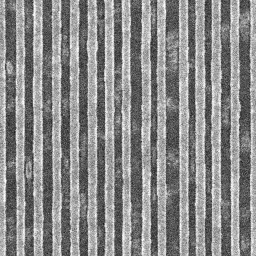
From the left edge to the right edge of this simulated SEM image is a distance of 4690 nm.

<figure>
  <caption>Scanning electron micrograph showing parallel lines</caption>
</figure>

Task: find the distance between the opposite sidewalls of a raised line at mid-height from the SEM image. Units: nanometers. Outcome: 133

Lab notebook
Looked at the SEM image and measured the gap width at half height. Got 0.183 um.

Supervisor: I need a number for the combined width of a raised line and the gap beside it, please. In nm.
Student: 328